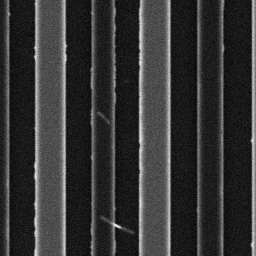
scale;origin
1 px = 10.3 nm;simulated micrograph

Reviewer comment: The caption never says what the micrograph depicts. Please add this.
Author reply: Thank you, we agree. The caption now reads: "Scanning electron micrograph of lines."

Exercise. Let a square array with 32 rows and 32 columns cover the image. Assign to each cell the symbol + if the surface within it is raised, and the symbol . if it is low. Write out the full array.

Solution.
+...++++....++....+++....+++....
+...++++....++...++++....+++....
+...++++....++...++++....+++....
+...++++....++...++++....+++....
+...++++....++...++++....+++....
+...++++....++...++++....+++....
+...++++....++...++++....+++....
+...++++....++...++++....+++....
+...++++....++...++++....+++....
+...++++...+++...++++....+++....
+...++++...+++...++++....+++....
+...++++....++...++++....+++....
+...++++....++...++++....+++....
+...++++....++...++++....+++....
+...++++....++...++++....+++....
+...++++...+++...++++....+++....
+...++++....++...++++....+++....
+...++++....++...++++....+++...+
+...++++....++...++++....+++....
+...++++....++...++++....+++....
+...++++....++...++++....+++....
+...++++....++...++++....+++....
+...++++....++...++++....+++....
+...++++....++...++++....+++....
+...++++....++...++++....+++....
+...++++....++...++++....+++....
+...++++....++...++++....+++....
+...++++....++...++++....+++....
+...++++...+++...++++....+++....
+...++++...+++...++++....+++....
+...++++...+++...++++....+++...+
+...++++...+++...++++....+++....